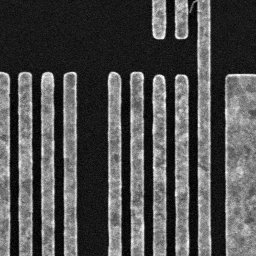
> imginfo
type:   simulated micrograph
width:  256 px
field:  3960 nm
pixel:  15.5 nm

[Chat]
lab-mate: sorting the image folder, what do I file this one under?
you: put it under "wiring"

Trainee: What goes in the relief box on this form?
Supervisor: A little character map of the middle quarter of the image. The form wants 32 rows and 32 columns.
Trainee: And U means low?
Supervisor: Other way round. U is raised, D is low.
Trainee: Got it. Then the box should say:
DDDDDDDDDDDDDDDDDDDDDDDDDDDDDDDD
DDDDDDDDDDDDDDDDDDDDDDDDDDDDDDDD
UUUDDDDDDDDDUDDDDUUUDDDDDDDDDDDD
UUUDDDDDDDDUUUDDDUUUDDDUUDDDUUUD
UUUDDDDDDDDUUUDDDUUUDDUUUDDDUUUD
UUUDDDDDDDDUUUDDDUUUDDUUUDDDUUUD
UUUDDDDDDDDUUUDDDUUUDDUUUDDDUUUD
UUUDDDDDDDDUUUDDDUUUDDUUUDDDUUUD
UUUDDDDDDDDUUUDDDUUUDDUUUDDDUUUD
UUUDDDDDDDDUUUDDDUUUDDUUUDDDUUUD
UUUDDDDDDDDUUUDDDUUUDDUUUDDDUUUD
UUUDDDDDDDDUUUDDDUUUDDUUUDDDUUUD
UUUDDDDDDDDUUUDDDUUUDDUUUDDDUUUD
UUUDDDDDDDDUUUDDDUUUDDUUUDDDUUUD
UUUDDDDDDDDUUUDDDUUUDDUUUDDDUUUD
UUUDDDDDDDDUUUDDDUUUDDUUUDDDUUUD
UUUDDDDDDDDUUUDDDUUUDDUUUDDDUUUD
UUUDDDDDDDDUUUDDDUUUDDUUUDDDUUUD
UUUDDDDDDDDUUUDDDUUUDDUUUDDDUUUD
UUUDDDDDDDDUUUDDDUUUDDUUUDDDUUUD
UUUDDDDDDDDUUUDDDUUUDDUUUDDDUUUD
UUUDDDDDDDDUUUDDDUUUDDUUUDDDUUUD
UUUDDDDDDDDUUUDDDUUUDDUUUDDDUUUD
UUUDDDDDDDDUUUDDDUUUDDUUUDDDUUUD
UUUDDDDDDDDUUUDDDUUUDDUUUDDDUUUD
UUUDDDDDDDDUUUDDDUUUDDUUUDDDUUUD
UUUDDDDDDDDUUUDDDUUUDDDUUDDDUUUD
UUUDDDDDDDDUUUDDDUUUDDDUUDDDUUUD
UUUDDDDDDDDUUUDDDUUUDDDUUDDDUUUD
UUUDDDDDDDDUUUDDDUUUDDDUUDDDUUUD
UUUDDDDDDDDUUUDDDUUUDDDUUDDDUUUD
UUUDDDDDDDDUUUDDDUUUDDDUUDDDUUUD